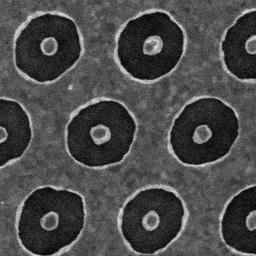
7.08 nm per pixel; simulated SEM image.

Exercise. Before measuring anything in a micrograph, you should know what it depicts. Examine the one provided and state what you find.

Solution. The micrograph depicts ring-shaped grooves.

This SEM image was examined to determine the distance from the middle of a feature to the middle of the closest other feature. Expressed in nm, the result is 710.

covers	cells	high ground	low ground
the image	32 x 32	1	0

11111111111111111111111111111111
11111111111111111110111111111110
11110000011111110000001111111100
11100000001111100000000111111000
11000000001111100000000111110000
11000110001111100011000111110001
11000110001111100010000111110001
11000000001111100000001111110000
11000000011111100000001111110000
11100000111111111000111111111000
11111111111111111111111111111111
11111111111111111111111111111111
01111111111110111111111100011111
00011111110000001111111000000111
00001111100000000111110000000011
00001111100000000111110000000011
10001111000111000111100011000011
00001111000010000111100001000111
00011111100000001111100000000111
00011111100000001111110000001111
01111111110000111111111101111111
11111111111111111111111111111111
11111111111111111111111111111111
11111001111111111100111111111110
11110000001111111000001111111000
11100000001111110000000111110000
11000000001111100000000111110000
11000110001111100011000111110001
11000010001111100010000111110001
11000000001111100000001111110000
11100000011111110000011111110000
11110000111111111000111111111100